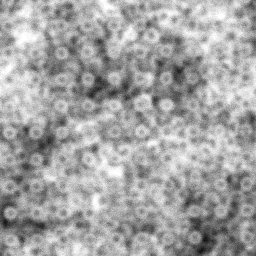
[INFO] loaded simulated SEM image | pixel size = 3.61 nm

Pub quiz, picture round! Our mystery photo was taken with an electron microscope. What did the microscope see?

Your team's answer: a regular array of raised bodies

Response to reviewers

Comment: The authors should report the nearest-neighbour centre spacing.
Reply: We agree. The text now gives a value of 56.1 nanometers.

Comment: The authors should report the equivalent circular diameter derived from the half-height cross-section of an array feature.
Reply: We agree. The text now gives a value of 0.0407 µm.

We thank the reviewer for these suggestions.